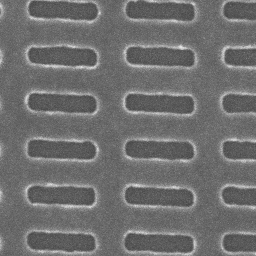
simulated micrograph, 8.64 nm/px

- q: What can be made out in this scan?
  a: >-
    a regular array of holes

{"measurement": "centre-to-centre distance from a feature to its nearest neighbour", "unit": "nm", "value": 401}